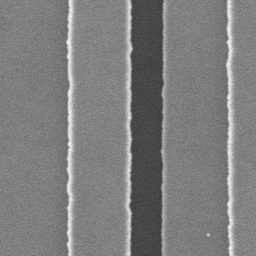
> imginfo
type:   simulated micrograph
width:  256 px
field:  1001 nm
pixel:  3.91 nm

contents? lines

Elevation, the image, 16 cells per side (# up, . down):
########..######
########..######
########..######
########..######
########..######
########..######
########..######
########..######
########..######
########..######
########..######
########..######
########..######
########..######
########..######
########..######